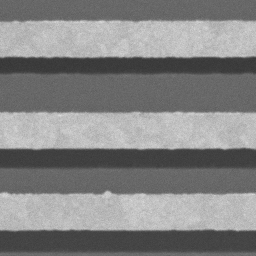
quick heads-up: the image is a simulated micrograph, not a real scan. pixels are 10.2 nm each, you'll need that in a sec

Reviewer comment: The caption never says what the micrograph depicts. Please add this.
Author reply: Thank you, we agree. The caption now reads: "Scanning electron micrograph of lines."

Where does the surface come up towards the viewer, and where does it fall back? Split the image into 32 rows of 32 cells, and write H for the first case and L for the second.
HHHHHHHHHHHHHHHHHHHHHHHHHHHHHHHH
HHHHHHHHHHHHHHHHHHHHHHHHHHHHHHHH
HHHHHHHHHHHHHHHHHHHHHHHHHHHHHHHH
HHHHHHHHHHHHHHHHHHHHHHHHHHHHHHHH
HHHHHHHHHHHHHHHHHHHHHHHHHHHHHHHH
HHHHHHHHHHHHHHHHHHHHHHHHHHHHHHHH
HHHHHHHHHHHHHHHHHHHHHHHHHHHHHHHH
LLLLLLLLLLLLLLLLLLLLLLLLLLLLLLLL
LLLLLLLLLLLLLLLLLLLLLLLLLLLLLLLL
HHHHHHHHHHHHHHHHHHHHHHHHHHHHHHHH
HHHHHHHHHHHHHHHHHHHHHHHHHHHHHHHH
HHHHHHHHHHHHHHHHHHHHHHHHHHHHHHHH
HHHHHHHHHHHHHHHHHHHHHHHHHHHHHHHH
HHHHHHHHHHHHHHHHHHHHHHHHHHHHHHHH
HHHHHHHHHHHHHHHHHHHHHHHHHHHHHHHH
HHHHHHHHHHHHHHHHHHHHHHHHHHHHHHHH
HHHHHHHHHHHHHHHHHHHHHHHHHHHHHHHH
HHHHHHHHHHHHHHHHHHHHHHHHHHHHHHHH
HHHHHHHHHHHHHHHHHHHHHHHHHHHHHHHH
LLLLLLLLLLLLLLLLLLLLLLLLLLLLLLLL
LLLLLLLLLLLLLLLLLLLLLLLLLLLLLLLL
HHHHHHHHHHHHHHHHHHHHHHHHHHHHHHHH
HHHHHHHHHHHHHHHHHHHHHHHHHHHHHHHH
HHHHHHHHHHHHHHHHHHHHHHHHHHHHHHHH
HHHHHHHHHHHHHHHHHHHHHHHHHHHHHHHH
HHHHHHHHHHHHHHHHHHHHHHHHHHHHHHHH
HHHHHHHHHHHHHHHHHHHHHHHHHHHHHHHH
HHHHHHHHHHHHHHHHHHHHHHHHHHHHHHHH
HHHHHHHHHHHHHHHHHHHHHHHHHHHHHHHH
LLLLLLLLLLLLLLLLLLLLLLLLLLLLLLLL
LLLLLLLLLLLLLLLLLLLLLLLLLLLLLLLL
LLLLLLLLLLLLLLLLLLLLLLLLLLLLLLLL